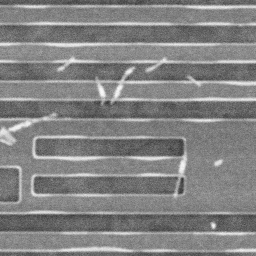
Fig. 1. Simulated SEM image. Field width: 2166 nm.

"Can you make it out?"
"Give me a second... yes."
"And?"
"groups of lines, slits or small figures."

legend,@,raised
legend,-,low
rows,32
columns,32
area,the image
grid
--------------------------------
@@@@@@@@@@@@@@@@@@@@@@@@@@@@@@@@
@@@@@@@@@@@@@@@@@@@@@@@@@@@@@@@@
--------------------------------
--------------------------------
@@@@@@@-----@@@@@@@@-------@@@@@
@@@@@@@@@@@@@@@@@@@@@@@@@@@@@@@@
@@@@@@@@@@@@@@@@@@@@@@@@@@@@@@@@
--------------------------------
--------------------------------
@@@@@@@@@@@@@@@@@@@@@@@@@@@@@@@@
@@@@@@@@@@@@@@@@@@@@@@@@@@@@@@@@
------------@@@-----------------
--------------------------------
--------------------------------
@@@@@@@@@@@@@@@@@@@@@@@@@@@@@@@@
@@@@@@@@@@@@@@@@@@@@@@@@@@@@@@@@
@@@@-------------------@@@@@@@@@
@@@@-------------------@@@@@@@@@
@@@@@------------------@@@@@@@@@
@@@@@@@@@@@@@@@@@@@@@@@@@@@@@@@@
--@@@@@@@@@@@@@@@@@@@@@@@@@@@@@@
---@-------------------@@@@@@@@@
---@-------------------@@@@@@@@@
---@@@@@@@@@@@@@@@@@@@@@@@@@@@@@
@@@@@@@@@@@@@@@@@@@@@@@@@@@@@@@@
@@@@@@@@@@@@@@@@@@@@@@@@@@@@@@@@
--------------------------------
--------------------------------
@@@@@@@@@@@@@@@@@@@@@@@@@@@@@@@@
@@@@@@@@@@@@@@@@@@@@@@@@@@@@@@@@
--------------------------------